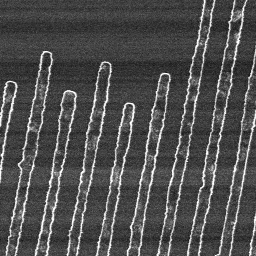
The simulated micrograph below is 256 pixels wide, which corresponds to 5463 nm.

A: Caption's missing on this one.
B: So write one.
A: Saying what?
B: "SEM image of parallel lines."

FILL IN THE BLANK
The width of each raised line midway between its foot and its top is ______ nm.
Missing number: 218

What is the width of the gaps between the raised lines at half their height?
418 nm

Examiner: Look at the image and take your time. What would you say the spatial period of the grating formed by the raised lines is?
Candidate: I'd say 640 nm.